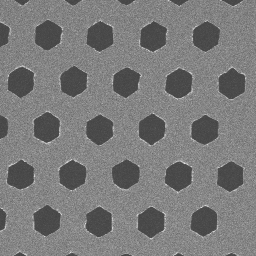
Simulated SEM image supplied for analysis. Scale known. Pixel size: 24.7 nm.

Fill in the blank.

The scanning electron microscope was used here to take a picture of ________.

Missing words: a regular array of holes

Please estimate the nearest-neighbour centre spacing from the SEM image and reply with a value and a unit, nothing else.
1290 nm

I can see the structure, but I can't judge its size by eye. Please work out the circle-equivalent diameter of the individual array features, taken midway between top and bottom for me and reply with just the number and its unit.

694 nanometers